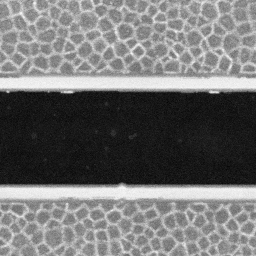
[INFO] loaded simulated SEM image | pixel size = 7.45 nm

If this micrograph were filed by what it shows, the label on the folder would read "one or a few lines or trenches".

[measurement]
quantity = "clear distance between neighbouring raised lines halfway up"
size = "816 nm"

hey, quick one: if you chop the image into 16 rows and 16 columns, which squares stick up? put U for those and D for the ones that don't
UUUUUUUUUUUUUUUU
UUUUUUUUUUUUUUUU
UUUUUUUUUUUUUUUU
UUUUUUUUUUUUUUUU
UUUUUUUUUUUUUUUU
DDDDDDDDDDDDDDDD
DDDDDDDDDDDDDDDD
DDDDDDDDDDDDDDDD
DDDDDDDDDDDDDDDD
DDDDDDDDDDDDDDDD
DDDDDDDDDDDDDDDD
DDDDDDDDDDDDDDDD
UUUUUUUUUUUUUUUU
UUUUUUUUUUUUUUUU
UUUUUUUUUUUUUUUU
UUUUUUUUUUUUUUUU